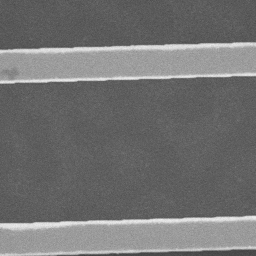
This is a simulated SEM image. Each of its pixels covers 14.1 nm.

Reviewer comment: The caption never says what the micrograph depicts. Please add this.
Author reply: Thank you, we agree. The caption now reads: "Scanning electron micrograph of lines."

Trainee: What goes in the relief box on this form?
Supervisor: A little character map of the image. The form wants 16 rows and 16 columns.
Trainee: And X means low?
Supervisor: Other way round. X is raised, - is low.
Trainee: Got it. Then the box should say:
----------------
----------------
----------------
XXXXXXXXXXXXXXXX
XXXXXXXXXXXXXXXX
----------------
----------------
----------------
----------------
----------------
----------------
----------------
----------------
----------------
XXXXXXXXXXXXXXXX
XXXXXXXXXXXXXXXX